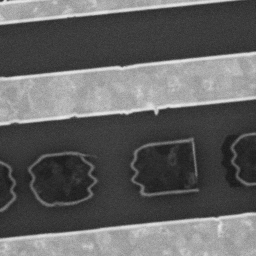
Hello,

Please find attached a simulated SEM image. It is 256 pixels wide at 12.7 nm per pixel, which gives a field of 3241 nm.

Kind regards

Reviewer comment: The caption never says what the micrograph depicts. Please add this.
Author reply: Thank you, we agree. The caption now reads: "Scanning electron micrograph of one or a few lines or trenches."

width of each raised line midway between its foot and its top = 551 nanometers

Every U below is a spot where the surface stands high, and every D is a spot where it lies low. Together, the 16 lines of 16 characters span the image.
UUUUUUUUUDDDDDDD
DDDDDDDDDDDDDDDD
DDDDDDDDDDDDDDDD
DDDDDDDDDDDDDDDU
DDDDDUUUUUUUUUUU
UUUUUUUUUUUUUUUU
UUUUUUUUUUUUDDDD
UUDDDDDDDDDDDDDD
DDDDDDDDDDDDDDDU
DDDDDDDDDUUUDDDU
DDUUUUDDUUUUDDDU
UDUUUUDDDUUUDDDD
UDDUUDDDDDDDDDDD
DDDDDDDDDDDDDDDU
DDDDDUUUUUUUUUUU
UUUUUUUUUUUUUUUU